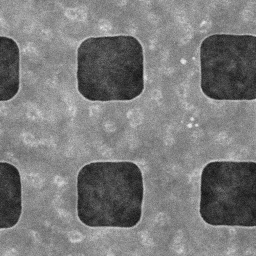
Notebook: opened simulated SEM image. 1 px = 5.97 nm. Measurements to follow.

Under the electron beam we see holes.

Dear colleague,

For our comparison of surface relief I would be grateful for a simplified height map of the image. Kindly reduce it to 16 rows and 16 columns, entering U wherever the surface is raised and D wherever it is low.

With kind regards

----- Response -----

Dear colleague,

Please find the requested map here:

UUUUUUUUUUUUUUUU
UUUUUUUUUUUUUUUU
DUUUUDDDUUUUUDDD
DUUUUDDDDUUUUDDD
DUUUUDDDDUUUUDDD
DUUUUDDDDUUUUDDD
UUUUUUUUUUUUUUUU
UUUUUUUUUUUUUUUU
UUUUUUUUUUUUUUUU
UUUUUUUUUUUUUUUU
DUUUUDDDDUUUUDDD
DUUUUDDDDUUUUDDD
DUUUUDDDDUUUUDDD
DUUUUDDDDUUUUDDD
UUUUUUUUUUUUUUUU
UUUUUUUUUUUUUUUU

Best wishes